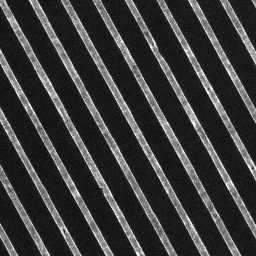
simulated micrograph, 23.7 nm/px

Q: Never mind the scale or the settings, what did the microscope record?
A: parallel lines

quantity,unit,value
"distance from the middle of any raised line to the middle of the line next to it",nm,660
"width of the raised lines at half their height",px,6.68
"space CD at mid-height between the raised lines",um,0.504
